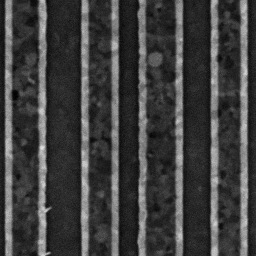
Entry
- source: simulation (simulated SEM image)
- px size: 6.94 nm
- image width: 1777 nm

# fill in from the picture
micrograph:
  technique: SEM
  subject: one or a few lines or trenches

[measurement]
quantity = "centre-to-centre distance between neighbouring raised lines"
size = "471 nm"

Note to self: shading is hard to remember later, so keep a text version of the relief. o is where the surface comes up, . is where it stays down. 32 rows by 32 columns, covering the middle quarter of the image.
.....oooooooo.......ooooooooo...
.....oooooooo.......ooooooooo...
.....oooooooo.......ooooooooo...
.....oooooooo.......ooooooooo...
.....oooooooo.......ooooooooo...
.....oooooooo.......ooooooooo...
.....oooooooo.......ooooooooo...
.....oooooooo.......ooooooooo...
.....oooooooo.......ooooooooo...
.....oooooooo.......ooooooooo...
.....oooooooo.......ooooooooo...
.....oooooooo.......ooooooooo...
.....oooooooo.......ooooooooo...
.....oooooooo.......ooooooooo...
.....oooooooo.......ooooooooo...
.....oooooooo.......ooooooooo...
.....oooooooo.......ooooooooo...
.....oooooooo.......ooooooooo...
.....oooooooo.......ooooooooo...
.....oooooooo.......ooooooooo...
.....oooooooo.......ooooooooo...
.....oooooooo......oooooooooo...
.....oooooooo......oooooooooo...
.....oooooooo......oooooooooo...
.....oooooooo.......ooooooooo...
.....oooooooo.......ooooooooo...
.....oooooooo.......ooooooooo...
.....oooooooo.......ooooooooo...
.....oooooooo.......ooooooooo...
.....oooooooo.......ooooooooo...
.....oooooooo......oooooooooo...
.....oooooooo......oooooooooo...